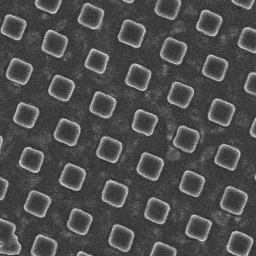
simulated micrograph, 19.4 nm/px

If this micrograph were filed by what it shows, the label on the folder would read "a regular array of raised bodies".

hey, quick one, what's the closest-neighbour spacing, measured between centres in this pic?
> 857 nanometers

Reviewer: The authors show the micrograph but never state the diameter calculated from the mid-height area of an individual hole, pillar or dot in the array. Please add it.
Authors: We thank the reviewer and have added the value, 471 nm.